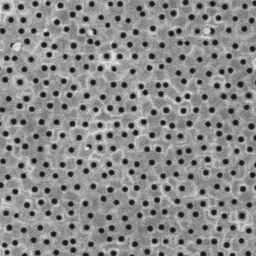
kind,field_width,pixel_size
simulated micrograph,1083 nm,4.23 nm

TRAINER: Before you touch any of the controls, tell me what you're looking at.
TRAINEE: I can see a regular array of holes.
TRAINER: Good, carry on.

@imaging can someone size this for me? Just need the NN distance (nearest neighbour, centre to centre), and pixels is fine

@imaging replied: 11.9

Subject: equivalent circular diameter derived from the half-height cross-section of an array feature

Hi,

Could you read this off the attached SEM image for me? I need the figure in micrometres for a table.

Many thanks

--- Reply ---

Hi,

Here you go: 0.0243